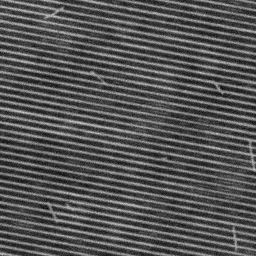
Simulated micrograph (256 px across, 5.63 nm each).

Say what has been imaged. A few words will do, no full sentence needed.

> parallel lines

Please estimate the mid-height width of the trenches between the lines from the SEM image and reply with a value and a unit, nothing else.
29.8 nanometres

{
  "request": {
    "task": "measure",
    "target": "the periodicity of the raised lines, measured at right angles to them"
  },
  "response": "40.2 nm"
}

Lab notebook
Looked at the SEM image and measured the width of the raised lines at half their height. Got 8.3 nm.